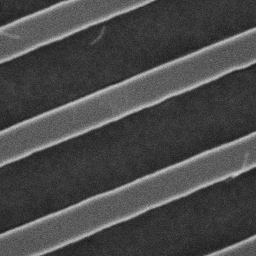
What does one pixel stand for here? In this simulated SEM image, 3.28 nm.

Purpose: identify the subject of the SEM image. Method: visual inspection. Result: lines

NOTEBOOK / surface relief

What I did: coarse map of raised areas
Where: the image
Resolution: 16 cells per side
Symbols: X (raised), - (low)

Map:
---XXXXXX-------
-XXXXX----------
XXXX----------XX
X-----------XXXX
---------XXXXX--
-------XXXXX----
----XXXXXX------
--XXXXX---------
XXXXX----------X
XX-----------XXX
----------XXXXXX
--------XXXXX---
-----XXXXXX-----
---XXXXX--------
XXXXXX----------
XXXX----------XX